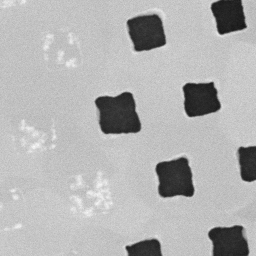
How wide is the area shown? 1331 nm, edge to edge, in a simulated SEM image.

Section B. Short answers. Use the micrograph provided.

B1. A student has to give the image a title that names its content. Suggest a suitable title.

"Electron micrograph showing holes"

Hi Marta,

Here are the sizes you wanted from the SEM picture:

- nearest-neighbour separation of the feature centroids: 0.436 um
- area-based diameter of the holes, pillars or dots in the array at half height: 0.207 micrometres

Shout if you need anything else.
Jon